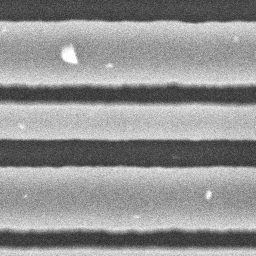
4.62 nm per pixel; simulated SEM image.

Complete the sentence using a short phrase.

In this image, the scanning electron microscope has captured lines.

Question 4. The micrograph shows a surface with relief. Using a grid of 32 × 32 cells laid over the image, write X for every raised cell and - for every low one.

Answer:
--------------------------------
--------------------------------
--------------------------------
XXXXXXXXXXXXXXXXXXXXXXXXXXXXXXXX
XXXXXXXXXXXXXXXXXXXXXXXXXXXXXXXX
XXXXXXXXXXXXXXXXXXXXXXXXXXXXXXXX
XXXXXXXXXXXXXXXXXXXXXXXXXXXXXXXX
XXXXXXXXXXXXXXXXXXXXXXXXXXXXXXXX
XXXXXXXXXXXXXXXXXXXXXXXXXXXXXXXX
XXXXXXXXXXXXXXXXXXXXXXXXXXXXXXXX
XXXXXXXXXX-XXXXXXXX----XXXXXXXXX
--------------------------------
--------------------------------
XXXXXXXXXXXXXXXXXXXXXXXXXXXXXXXX
XXXXXXXXXXXXXXXXXXXXXXXXXXXXXXXX
XXXXXXXXXXXXXXXXXXXXXXXXXXXXXXXX
XXXXXXXXXXXXXXXXXXXXXXXXXXXXXXXX
--------------------------------
--------------------------------
--------------------------------
--------------------------------
XXXXXXXXXXXXXXXXXXXXXXXXXXXXXXXX
XXXXXXXXXXXXXXXXXXXXXXXXXXXXXXXX
XXXXXXXXXXXXXXXXXXXXXXXXXXXXXXXX
XXXXXXXXXXXXXXXXXXXXXXXXXXXXXXXX
XXXXXXXXXXXXXXXXXXXXXXXXXXXXXXXX
XXXXXXXXXXXXXXXXXXXXXXXXXXXXXXXX
XXXXXXXXXXXXXXXXXXXXXXXXXXXXXXXX
XXXXXXXXXXXXXXXXXXXXXXXXXXXXXXXX
--------------------------------
--------------------------------
XXXXXXXXXXXXXXXXXXXXXXXXXXXXXXXX